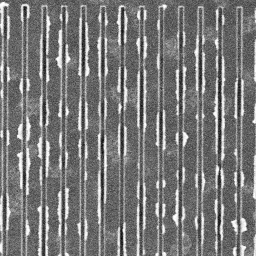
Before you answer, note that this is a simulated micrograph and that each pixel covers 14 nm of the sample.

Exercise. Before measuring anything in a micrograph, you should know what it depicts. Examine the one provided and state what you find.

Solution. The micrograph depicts parallel lines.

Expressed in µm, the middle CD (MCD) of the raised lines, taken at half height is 0.219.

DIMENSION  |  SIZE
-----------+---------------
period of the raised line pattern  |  273 nm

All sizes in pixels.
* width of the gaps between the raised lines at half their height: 4.25